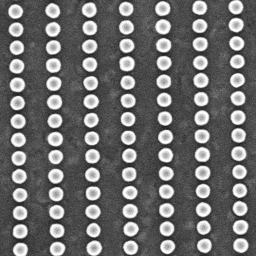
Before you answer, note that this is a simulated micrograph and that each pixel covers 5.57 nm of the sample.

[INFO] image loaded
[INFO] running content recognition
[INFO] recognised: a regular array of raised bodies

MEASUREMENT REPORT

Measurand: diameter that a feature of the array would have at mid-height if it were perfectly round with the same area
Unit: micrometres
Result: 0.0748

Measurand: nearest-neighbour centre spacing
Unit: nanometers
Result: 101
